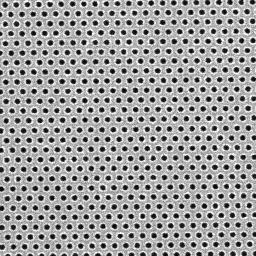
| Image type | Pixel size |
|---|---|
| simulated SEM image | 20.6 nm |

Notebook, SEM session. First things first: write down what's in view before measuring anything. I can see a regular array of holes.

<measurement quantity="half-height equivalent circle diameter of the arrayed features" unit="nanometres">123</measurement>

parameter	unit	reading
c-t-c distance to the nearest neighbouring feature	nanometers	224